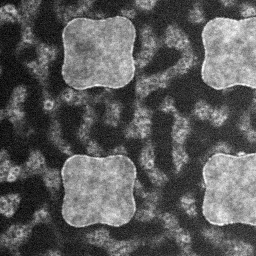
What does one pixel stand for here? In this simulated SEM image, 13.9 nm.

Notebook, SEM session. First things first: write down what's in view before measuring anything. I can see raised bodies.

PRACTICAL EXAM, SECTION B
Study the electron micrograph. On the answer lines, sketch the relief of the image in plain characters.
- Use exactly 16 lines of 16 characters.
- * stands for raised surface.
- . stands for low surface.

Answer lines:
................
....****.....***
....****.....***
....****.....***
....****.....***
................
................
................
................
................
....****.....***
....****.....***
....****.....***
....****.....***
................
................